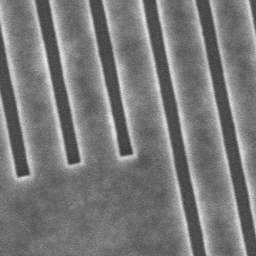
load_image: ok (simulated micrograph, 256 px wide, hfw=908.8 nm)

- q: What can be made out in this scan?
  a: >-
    parallel lines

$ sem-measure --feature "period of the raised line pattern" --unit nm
186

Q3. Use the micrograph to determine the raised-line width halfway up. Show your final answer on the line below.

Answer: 136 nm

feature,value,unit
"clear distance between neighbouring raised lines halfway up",49.3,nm